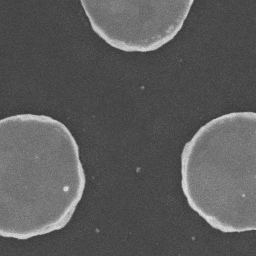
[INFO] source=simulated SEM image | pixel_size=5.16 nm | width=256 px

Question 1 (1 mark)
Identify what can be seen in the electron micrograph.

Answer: raised bodies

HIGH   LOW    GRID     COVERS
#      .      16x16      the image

.....#######....
......#####.....
.......###......
................
................
................
................
###..........###
####........####
#####.......####
#####.......####
#####.......####
#####.......####
####.........###
###.............
................